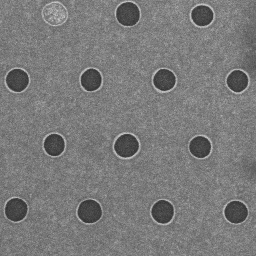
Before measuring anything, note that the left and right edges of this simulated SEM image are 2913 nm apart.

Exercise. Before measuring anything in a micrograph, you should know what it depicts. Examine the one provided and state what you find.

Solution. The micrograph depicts a regular array of holes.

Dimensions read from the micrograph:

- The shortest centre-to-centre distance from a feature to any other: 834 nm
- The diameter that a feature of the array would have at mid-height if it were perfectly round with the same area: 272 nanometres